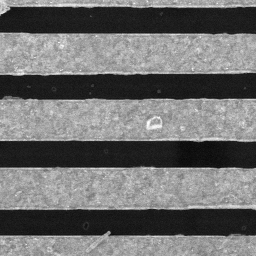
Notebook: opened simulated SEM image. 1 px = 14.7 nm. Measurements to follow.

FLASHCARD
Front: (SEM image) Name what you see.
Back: lines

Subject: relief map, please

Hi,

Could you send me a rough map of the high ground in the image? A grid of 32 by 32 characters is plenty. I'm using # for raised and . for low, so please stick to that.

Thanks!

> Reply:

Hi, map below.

################################
#...............................
................................
................................
################################
################################
################################
################################
################################
................................
................................
................................
...........##.....####.#########
################################
################################
################################
################################
################################
................................
................................
................................
################################
################################
################################
################################
################################
................................
................................
................................
............##..................
################################
################################